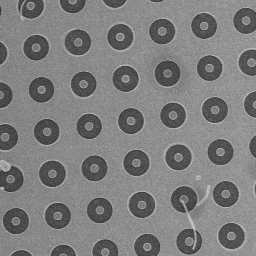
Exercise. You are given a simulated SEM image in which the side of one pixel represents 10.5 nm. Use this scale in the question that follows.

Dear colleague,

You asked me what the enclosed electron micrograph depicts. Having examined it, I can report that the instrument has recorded an array of small figures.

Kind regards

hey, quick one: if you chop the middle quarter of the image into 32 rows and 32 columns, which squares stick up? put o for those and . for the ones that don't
oooooooooooooo...oooooo......ooo
ooooooooooooo.....ooooo......ooo
ooo....ooooo.......ooo...oo..ooo
oo......oooo...o...oooo......ooo
oo..o...oooo.......oooo......ooo
oo..oo..ooooo.....oooooo...ooooo
oo......oooooo...ooooooooooooooo
oo.....ooooooooooooooooooooooooo
oooo..oooooooooooooooooooooooooo
oooooooooooooooooooooooooooooooo
ooooooooooooooooooooooooo.....oo
ooooooooooooooo....ooooo......oo
ooooo..ooooooo......oooo..oo...o
oooo.....ooooo..o...oooo...o...o
ooo......oooo...oo..oooo......oo
ooo..oo...oooo......ooooo....ooo
ooo......ooooo.....ooooooooooooo
oooo.....ooooooo..oooooooooooooo
ooooo...oooooooooooooooooooooooo
oooooooooooooooooooooooooooooooo
oooooooooooooooooooooooooo.....o
ooooooooooooooooo..ooooooo......
oooooooooooooooo.....oooo...o...
oooooo....ooooo......oooo...o...
ooooo......oooo..oo...ooo.......
oooo...o...oooo...o..ooooo.....o
.ooo...o...oooo......ooooooo..oo
.oooo......ooooo....oooooooooooo
.oooo.....oooooooooooooooooooooo
oooooooooooooooooooooooooooooooo
ooooooooooooooooooooooooooooo..o
oooooooooooooooooooooooooooo....